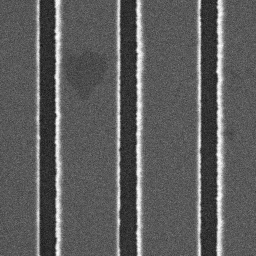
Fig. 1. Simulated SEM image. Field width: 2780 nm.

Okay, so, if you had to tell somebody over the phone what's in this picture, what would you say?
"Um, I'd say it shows lines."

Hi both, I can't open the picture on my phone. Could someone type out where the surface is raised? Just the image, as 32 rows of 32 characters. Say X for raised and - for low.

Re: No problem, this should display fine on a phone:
XXXXX--XXXXXXXX--XXXXXXXX--XXXXX
XXXXX--XXXXXXXX--XXXXXXXX--XXXXX
XXXXX--XXXXXXXX--XXXXXXXX--XXXXX
XXXXX--XXXXXXXX--XXXXXXXX--XXXXX
XXXXX--XXXXXXXX--XXXXXXXX--XXXXX
XXXXX--XXXXXXXX--XXXXXXXX--XXXXX
XXXXX--XXXXXXXX--XXXXXXXX--XXXXX
XXXXX--XXXXXXXX--XXXXXXXX--XXXXX
XXXXX--XXXXXXXX--XXXXXXXX--XXXXX
XXXXX--XXXXXXXX--XXXXXXXX--XXXXX
XXXXX--XXXXXXXX--XXXXXXXX--XXXXX
XXXXX--XXXXXXXX--XXXXXXXX--XXXXX
XXXXX--XXXXXXXX--XXXXXXXX--XXXXX
XXXXX--XXXXXXXX--XXXXXXXX--XXXXX
XXXXX--XXXXXXXX--XXXXXXXX--XXXXX
XXXXX--XXXXXXXX--XXXXXXXX--XXXXX
XXXXX--XXXXXXXX--XXXXXXXX--XXXXX
XXXXX--XXXXXXXX--XXXXXXXX--XXXXX
XXXXX--XXXXXXXX--XXXXXXXX--XXXXX
XXXXX--XXXXXXXX--XXXXXXXX--XXXXX
XXXXX--XXXXXXXX--XXXXXXXX--XXXXX
XXXXX--XXXXXXXX--XXXXXXXX--XXXXX
XXXXX--XXXXXXXX--XXXXXXXX--XXXXX
XXXXX--XXXXXXXX--XXXXXXXX--XXXXX
XXXXX--XXXXXXXX--XXXXXXXX--XXXXX
XXXXX--XXXXXXXX--XXXXXXXX--XXXXX
XXXXX--XXXXXXXX--XXXXXXXX--XXXXX
XXXXX--XXXXXXXX--XXXXXXXX--XXXXX
XXXXX--XXXXXXXX--XXXXXXXX--XXXXX
XXXXX--XXXXXXXX--XXXXXXXX--XXXXX
XXXXX--XXXXXXXX--XXXXXXXX--XXXXX
XXXXX--XXXXXXXX--XXXXXXXX--XXXXX